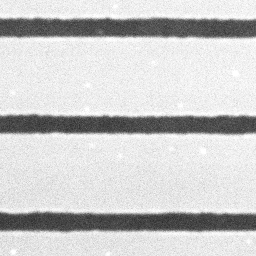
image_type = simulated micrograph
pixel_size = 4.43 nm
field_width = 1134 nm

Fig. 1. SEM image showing lines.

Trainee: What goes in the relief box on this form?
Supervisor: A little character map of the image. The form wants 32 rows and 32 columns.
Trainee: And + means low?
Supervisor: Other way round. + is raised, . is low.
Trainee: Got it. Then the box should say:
++++++++++++++++++++++++++++++++
++++++++++++++++++++++++++++++++
................................
................................
................................
++++++++++++++++++++++++++++++++
++++++++++++++++++++++++++++++++
++++++++++++++++++++++++++++++++
++++++++++++++++++++++++++++++++
++++++++++++++++++++++++++++++++
++++++++++++++++++++++++++++++++
++++++++++++++++++++++++++++++++
++++++++++++++++++++++++++++++++
++++++++++++++++++++++++++++++++
................................
................................
................................
++++++++++++++++++++++++++++++++
++++++++++++++++++++++++++++++++
++++++++++++++++++++++++++++++++
++++++++++++++++++++++++++++++++
++++++++++++++++++++++++++++++++
++++++++++++++++++++++++++++++++
++++++++++++++++++++++++++++++++
++++++++++++++++++++++++++++++++
++++++++++++++++++++++++++++++++
.+++.....++++++++++++..++.++++++
................................
................................
++++++++++++++++++++++++++++++++
++++++++++++++++++++++++++++++++
++++++++++++++++++++++++++++++++